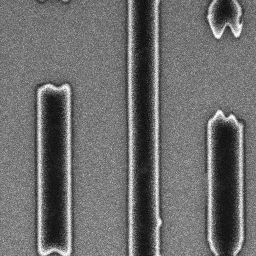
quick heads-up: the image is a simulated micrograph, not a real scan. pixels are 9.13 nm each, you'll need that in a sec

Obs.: one or a few lines or trenches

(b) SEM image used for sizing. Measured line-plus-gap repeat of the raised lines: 780 nanometres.